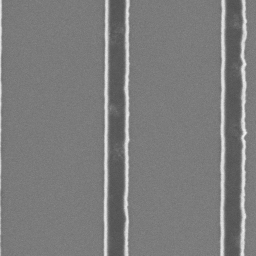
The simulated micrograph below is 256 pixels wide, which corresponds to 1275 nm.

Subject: one or a few lines or trenches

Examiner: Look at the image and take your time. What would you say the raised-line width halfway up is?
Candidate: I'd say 110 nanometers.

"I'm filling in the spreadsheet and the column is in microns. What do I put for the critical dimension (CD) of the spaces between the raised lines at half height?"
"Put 0.474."